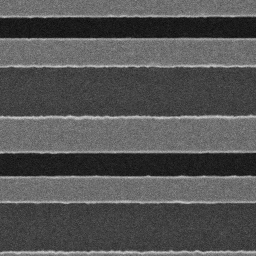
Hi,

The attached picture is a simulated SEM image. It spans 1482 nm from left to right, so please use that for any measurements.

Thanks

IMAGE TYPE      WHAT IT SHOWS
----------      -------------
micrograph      lines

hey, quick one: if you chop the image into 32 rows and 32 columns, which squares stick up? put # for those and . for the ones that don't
################################
################################
................................
................................
................................
################################
################################
################################
................................
................................
................................
................................
................................
................................
................................
################################
################################
################################
################################
................................
................................
................................
################################
################################
################################
................................
................................
................................
................................
................................
................................
.#..####.#.#####..##.###########